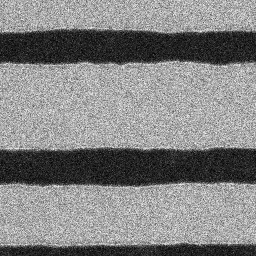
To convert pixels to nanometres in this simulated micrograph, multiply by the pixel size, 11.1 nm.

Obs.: one or a few lines or trenches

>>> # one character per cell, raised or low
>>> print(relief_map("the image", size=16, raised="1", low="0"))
0000000000000000
0000000000000000
1111111111111111
1111111111111111
0000000000000000
0000000000000000
0000000000000000
0000000000000000
0000000000000000
1111111111111111
1111111111111111
1111111111111111
0000000000000000
0000000000000000
0000000000000000
1111111111111111